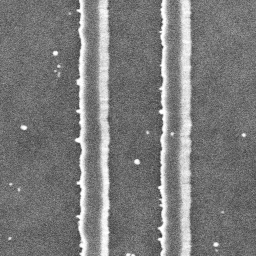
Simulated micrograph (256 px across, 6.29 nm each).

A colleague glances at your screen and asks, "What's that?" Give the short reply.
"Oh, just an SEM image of lines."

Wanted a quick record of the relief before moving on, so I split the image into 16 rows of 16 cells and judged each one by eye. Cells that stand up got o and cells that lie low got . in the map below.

.....oo...oo....
.....oo...oo....
.....oo...oo....
.....oo...oo....
.....oo...oo....
.....oo...oo....
.....oo...oo....
.....oo...oo....
.....oo...oo....
.....oo...oo....
.....oo...oo....
.....oo...oo....
.....oo...oo....
.....oo...oo....
.....oo...oo....
.....oo...oo....